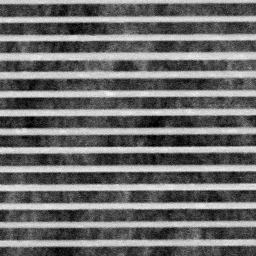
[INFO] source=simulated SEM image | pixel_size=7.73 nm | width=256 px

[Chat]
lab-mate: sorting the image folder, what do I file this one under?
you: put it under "parallel lines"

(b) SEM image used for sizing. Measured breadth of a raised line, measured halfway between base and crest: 0.0416 um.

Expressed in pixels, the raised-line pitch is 18.7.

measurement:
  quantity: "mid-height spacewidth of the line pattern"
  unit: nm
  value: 103